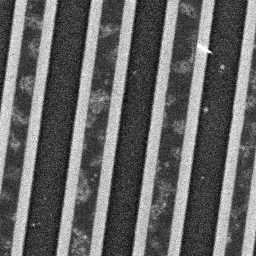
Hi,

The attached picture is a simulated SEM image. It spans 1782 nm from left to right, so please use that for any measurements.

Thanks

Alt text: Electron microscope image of one or a few lines or trenches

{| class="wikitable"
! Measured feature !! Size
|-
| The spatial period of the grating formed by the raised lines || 0.532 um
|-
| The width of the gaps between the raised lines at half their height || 45.3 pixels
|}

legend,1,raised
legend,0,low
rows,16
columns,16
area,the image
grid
0110001100011000
0110001100011000
0110001100111000
0110001100111001
0110011100110001
0100011000110001
1100011000110001
1100011000110001
1100011000110001
1100011000110001
1100011001110011
1100011001100011
1000110001100011
1000110001100011
1000110001100011
1000110001100010